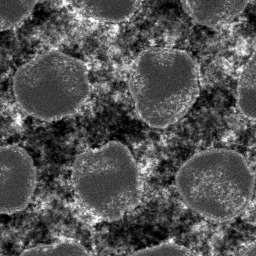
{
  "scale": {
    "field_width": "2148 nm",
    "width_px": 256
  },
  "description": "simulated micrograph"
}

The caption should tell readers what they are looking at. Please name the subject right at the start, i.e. raised bodies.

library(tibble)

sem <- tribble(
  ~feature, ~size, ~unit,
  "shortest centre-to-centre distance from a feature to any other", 0.917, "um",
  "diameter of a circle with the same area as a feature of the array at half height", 595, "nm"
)